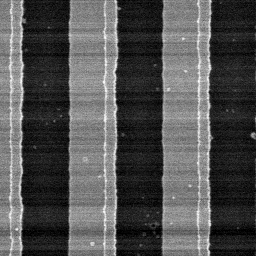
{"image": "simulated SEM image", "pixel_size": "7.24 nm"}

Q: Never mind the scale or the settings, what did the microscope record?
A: lines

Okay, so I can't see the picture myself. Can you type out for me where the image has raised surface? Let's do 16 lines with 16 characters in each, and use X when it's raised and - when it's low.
X---XXX---XXX---
X---XXX---XXX---
X---XXX---XXX---
X---XXX---XXX---
X---XXX---XXX---
X---XXX---XXX---
X---XXX---XXX---
X---XXX---XXX---
X---XXX---XXX---
X---XXX---XXX---
X---XXX---XXX---
X---XXX---XXX---
X---XXX---XXX---
X---XXX---XXX---
X---XXX---XXX---
X---XXX---XXX---